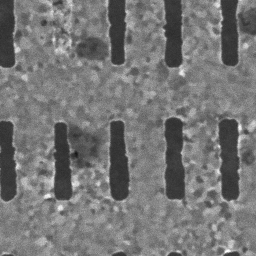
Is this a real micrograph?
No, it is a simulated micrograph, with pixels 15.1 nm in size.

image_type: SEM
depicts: holes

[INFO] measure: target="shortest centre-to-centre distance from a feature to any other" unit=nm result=840